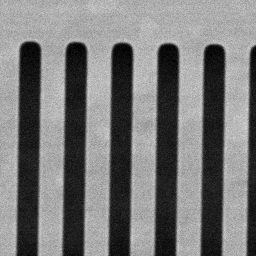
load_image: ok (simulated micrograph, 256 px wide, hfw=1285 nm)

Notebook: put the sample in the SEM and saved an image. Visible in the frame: groups of lines, slits or small figures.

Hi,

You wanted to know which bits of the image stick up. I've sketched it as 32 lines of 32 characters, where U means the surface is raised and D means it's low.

UUUUUUUUUUUUUUUUUUUUUUUUUUUUUUUU
UUUUUUUUUUUUUUUUUUUUUUUUUUUUUUUU
UUUUUUUUUUUUUUUUUUUUUUUUUUUUUUUU
UUUUUUUUUUUUUUUUUUUUUUUUUUUUUUUU
UUUUUUUUUUUUUUUUUUUUUUUUUUUUUUUU
UUUDDUUUUDUUUUDDUUUUDDUUUUUUUUUU
UUDDDUUUDDDUUUDDDUUUDDUUUDDDUUUD
UUDDDUUUDDDUUUDDDUUUDDDUUDDDUUUD
UUDDDUUUDDDUUUDDDUUUDDUUUDDDUUUD
UUDDDUUUDDDUUUDDDUUUDDUUUDDDUUUD
UUDDDUUUDDDUUUDDDUUUDDUUUDDDUUUD
UUDDDUUUDDDUUUDDDUUUDDUUUDDDUUUD
UUDDDUUUDDDUUUDDDUUUDDUUUDDDUUUD
UUDDDUUUDDDUUUDDDUUUDDUUUDDDUUUD
UUDDDUUUDDDUUUDDDUUUDDUUUDDDUUUD
UUDDDUUUDDDUUUDDDUUUDDUUUDDDUUUD
UUDDDUUUDDDUUUDDDUUDDDUUUDDDUUUD
UUDDDUUUDDDUUUDDDUUDDDUUUDDDUUUD
UUDDDUUUDDDUUUDDDUUDDDUUUDDDUUUD
UUDDDUUUDDDUUUDDDUUDDDUUUDDDUUUD
UUDDDUUUDDDUUUDDDUUDDDUUUDDDUUUD
UUDDDUUUDDDUUUDDDUUDDDUUUDDDUUUD
UUDDDUUUDDDUUUDDDUUDDDUUUDDDUUUD
UUDDDUUUDDDUUUDDDUUDDDUUUDDDUUUD
UUDDDUUUDDDUUUDDDUUDDDUUUDDDUUUD
UUDDDUUUDDDUUUDDUUUDDDUUUDDDUUUD
UUDDDUUUDDDUUUDDUUUDDDUUUDDDUUUD
UUDDDUUUDDDUUUDDUUUDDDUUUDDDUUUD
UUDDDUUUDDDUUUDDUUUDDDUUUDDDUUUD
UUDDDUUUDDDUUUDDUUUDDDUUUDDDUUUD
UUDDDUUUDDDUUUDDUUUDDDUUUDDDUUUD
UUDDDUUUDDDUUUDDUUUDDDUUUDDDUUUD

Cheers